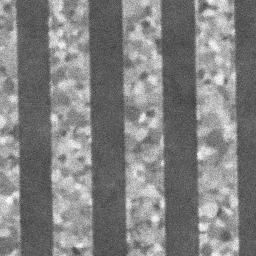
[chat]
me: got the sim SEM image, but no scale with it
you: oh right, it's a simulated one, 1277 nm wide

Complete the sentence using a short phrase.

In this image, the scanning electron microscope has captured one or a few lines or trenches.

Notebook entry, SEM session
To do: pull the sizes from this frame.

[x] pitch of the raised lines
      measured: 0.364 µm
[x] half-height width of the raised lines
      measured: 185 nanometres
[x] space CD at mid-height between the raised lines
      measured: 0.18 µm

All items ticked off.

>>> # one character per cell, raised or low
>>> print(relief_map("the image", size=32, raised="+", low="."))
++....+++++....+++++.....++++...
++....+++++....+++++.....++++...
++....+++++....+++++.....++++...
++....+++++....+++++.....++++...
++....+++++....+++++.....++++...
++....+++++....+++++.....++++...
++....+++++....+++++.....++++...
++....+++++.....++++.....++++...
++..+.+++++.....++++.....++++...
++....+++++.....++++.....++++...
++....+++++.....++++.....++++...
++....+++++.....++++.....++++...
++....+++++.....++++.....++++...
++....+++++.....++++.....++++...
++....+++++.....++++.....++++...
++....+++++.....++++.....++++...
++.....++++.....++++.....++++...
++.....++++.....++++.....+++++..
++.....++++.....++++.....+++++..
++.....++++.....+++++....+++++..
++.....++++.....++++.....+++++..
++.....++++.....++++.....+++++..
++.....++++.....++++.....+++++..
++.....++++.....++++.....+++++..
++.....++++.....++++.....+++++..
++.....++++.....++++.....+++++..
++.....++++.....+++++....+++++..
++.....++++.....++++.....+++++..
++.....++++.....++++.....+++++..
++.....++++.....++++.....+++++..
++.....++++.....++++.....+++++..
++.....++++.....++++.....+++++..